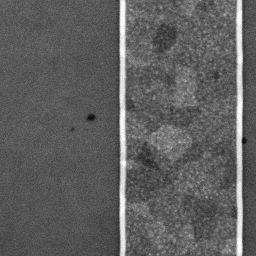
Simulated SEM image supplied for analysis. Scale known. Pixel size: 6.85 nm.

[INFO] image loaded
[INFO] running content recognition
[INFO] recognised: wiring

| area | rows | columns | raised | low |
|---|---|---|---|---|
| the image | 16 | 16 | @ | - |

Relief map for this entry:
--------@@@@@@@-
--------@@@@@@@-
--------@@@@@@@-
--------@@@@@@@-
--------@@@@@@@-
--------@@@@@@@-
--------@@@@@@@-
--------@@@@@@@-
--------@@@@@@@-
--------@@@@@@@-
--------@@@@@@@-
--------@@@@@@@-
--------@@@@@@@-
--------@@@@@@@-
--------@@@@@@@-
--------@@@@@@@-